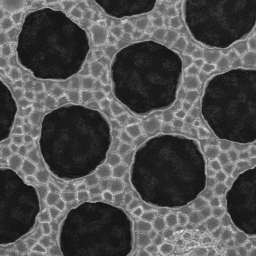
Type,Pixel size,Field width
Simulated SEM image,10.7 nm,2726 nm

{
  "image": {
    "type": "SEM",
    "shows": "holes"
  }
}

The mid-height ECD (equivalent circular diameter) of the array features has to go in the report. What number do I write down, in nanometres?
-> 777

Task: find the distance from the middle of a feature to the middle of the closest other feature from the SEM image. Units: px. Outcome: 96.8